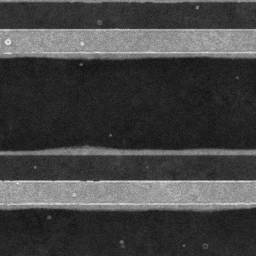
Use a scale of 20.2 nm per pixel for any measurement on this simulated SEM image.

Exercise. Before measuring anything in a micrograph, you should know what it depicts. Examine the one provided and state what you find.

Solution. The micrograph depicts lines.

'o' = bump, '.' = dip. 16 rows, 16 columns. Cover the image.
oooooooooooooooo
oooooooooooooooo
oooooooooooooooo
................
................
................
................
................
................
................
oooooooooooooooo
oooooooooooooooo
oooooooooooooooo
................
................
................